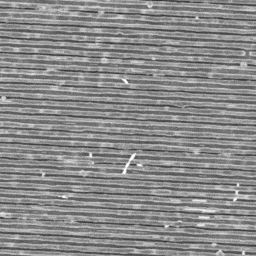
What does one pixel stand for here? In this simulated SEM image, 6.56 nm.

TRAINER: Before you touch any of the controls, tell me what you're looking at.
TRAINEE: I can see parallel lines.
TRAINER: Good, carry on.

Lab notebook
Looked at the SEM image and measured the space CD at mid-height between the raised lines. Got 22.9 nanometres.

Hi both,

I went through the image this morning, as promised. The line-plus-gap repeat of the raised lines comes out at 7.5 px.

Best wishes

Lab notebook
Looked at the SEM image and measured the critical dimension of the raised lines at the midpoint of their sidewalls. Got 29.5 nm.